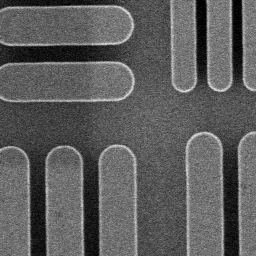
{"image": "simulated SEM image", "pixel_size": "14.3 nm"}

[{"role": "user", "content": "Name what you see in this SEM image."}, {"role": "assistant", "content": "groups of lines, slits or small figures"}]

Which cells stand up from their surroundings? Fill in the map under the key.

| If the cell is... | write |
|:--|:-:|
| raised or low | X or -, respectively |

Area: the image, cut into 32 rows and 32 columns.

---------------------XXX--XXX-XX
XXXXXXXXXXXXXXXX-----XXX--XXX-XX
XXXXXXXXXXXXXXXX-----XXX--XXX-XX
XXXXXXXXXXXXXXXXX----XXX--XXX-XX
XXXXXXXXXXXXXXXX-----XXX--XXX-XX
XXXXXXXXXXXXXXX------XXX--XXX-XX
---------------------XXX--XXX-XX
---------------------XXX--XXX-XX
XXXXXXXXXXXXXXXX-----XXX--XXX-XX
XXXXXXXXXXXXXXXXX----XXX--XXX-XX
XXXXXXXXXXXXXXXXX-----XX--XXX--X
XXXXXXXXXXXXXXXX----------------
XXXXXXXXXXXXXXX-----------------
--------------------------------
--------------------------------
--------------------------------
-------------------------------X
------------------------XXX---XX
XX-----XX----XXX-------XXXXX--XX
XXX---XXXX--XXXXX------XXXXX--XX
XXXX--XXXX--XXXXX------XXXXX--XX
XXXX--XXXX--XXXXX------XXXXX--XX
XXXX--XXXX--XXXXX------XXXXX--XX
XXXX--XXXX--XXXXX------XXXXX--XX
XXXX--XXXX--XXXXX------XXXXX--XX
XXXX--XXXX--XXXXX------XXXXX--XX
XXXX--XXXX--XXXXX------XXXXX--XX
XXXX--XXXX--XXXXX------XXXXX--XX
XXXX--XXXX--XXXXX------XXXXX--XX
XXXX--XXXX--XXXXX------XXXXX--XX
XXXX--XXXX--XXXXX------XXXXX--XX
XXXX--XXXX--XXXXX------XXXXX--XX